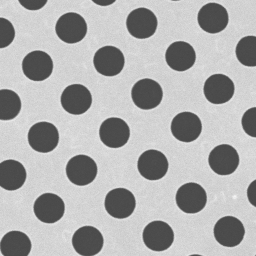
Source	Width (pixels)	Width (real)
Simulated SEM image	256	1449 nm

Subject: a regular array of holes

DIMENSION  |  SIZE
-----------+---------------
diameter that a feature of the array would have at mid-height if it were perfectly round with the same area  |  176 nanometres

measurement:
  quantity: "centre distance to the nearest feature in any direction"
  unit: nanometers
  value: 284